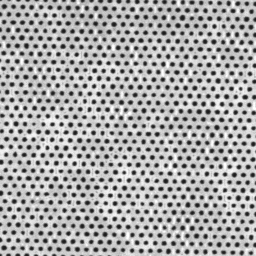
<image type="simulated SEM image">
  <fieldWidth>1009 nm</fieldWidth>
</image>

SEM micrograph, a regular array of holes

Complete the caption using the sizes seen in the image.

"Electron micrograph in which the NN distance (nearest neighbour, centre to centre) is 33.6 nm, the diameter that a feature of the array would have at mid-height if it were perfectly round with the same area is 18.3 nm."